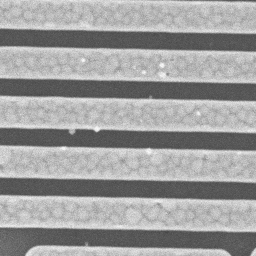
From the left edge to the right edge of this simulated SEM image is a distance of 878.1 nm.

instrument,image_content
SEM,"groups of lines, slits or small figures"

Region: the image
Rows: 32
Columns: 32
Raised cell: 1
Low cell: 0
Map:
11111111111111111111111111111111
11111111111111111111111111111111
11111111111111111111111111111111
11111111111111111111111111111111
00000000000000000000000000000000
00000000000000000000000000000000
11111111111111111111111111111100
11111111111111111111111111111111
11111111111111111111111111111111
11111111111111111111111111111111
00000000000000000000000000000000
00000000000000000000000000000000
11111111111111111110000000000000
11111111111111111111111111111111
11111111111111111111111111111111
11111111111111111111111111111111
00000000000000000000000000000011
00000000000000000000000000000000
11111111111000000000000000000000
11111111111111111111111111111111
11111111111111111111111111111111
11111111111111111111111111111111
00000000000000000000000001111111
00000000000000000000000000000000
00000000000000000000000000000000
11111111111111111111111111111111
11111111111111111111111111111111
11111111111111111111111111111111
00000000000111111111111111111111
00000000000000000000000000000000
00000000000000000000000000000000
00001111111111111111111111110000